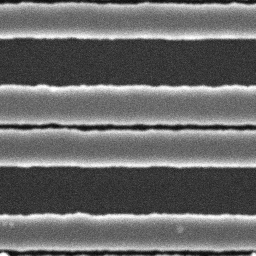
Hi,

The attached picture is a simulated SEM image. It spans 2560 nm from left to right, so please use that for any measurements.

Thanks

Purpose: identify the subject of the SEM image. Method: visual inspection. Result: lines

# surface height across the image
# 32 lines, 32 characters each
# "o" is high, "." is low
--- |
oooooooooooo.o...ooooooo.ooooooo
oooooooooooooooooooooooooooooooo
oooooooooooooooooooooooooooooooo
oooooooooooooooooooooooooooooooo
oooooooooooooooooooooooooooooooo
................................
................................
................................
................................
................................
................................
oooooooooooooooooooooooooooooooo
oooooooooooooooooooooooooooooooo
oooooooooooooooooooooooooooooooo
oooooooooooooooooooooooooooooooo
..o.oo.oooooooooo.oooooooooooooo
oooooooooooooooooooooooooooooooo
oooooooooooooooooooooooooooooooo
oooooooooooooooooooooooooooooooo
oooooooooooooooooooooooooooooooo
oooooooooooooooooooooooooooooooo
................................
................................
................................
................................
................................
................................
oooooooooooooooooooooooooooooooo
oooooooooooooooooooooooooooooooo
oooooooooooooooooooooooooooooooo
oooooooooooooooooooooooooooooooo
o...................oo.........o